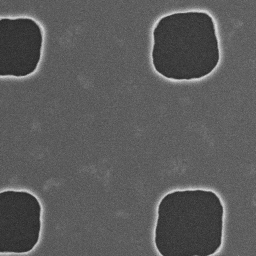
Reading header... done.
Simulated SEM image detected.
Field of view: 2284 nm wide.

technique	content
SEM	holes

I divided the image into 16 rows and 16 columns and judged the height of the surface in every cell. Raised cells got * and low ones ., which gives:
****************
..********...***
...*******....**
...*******....**
..********...***
****************
****************
****************
****************
****************
****************
****************
..********....**
..********....**
..********....**
..********....**